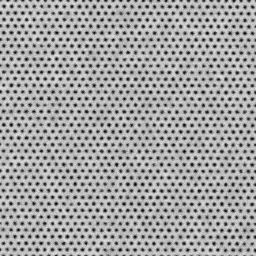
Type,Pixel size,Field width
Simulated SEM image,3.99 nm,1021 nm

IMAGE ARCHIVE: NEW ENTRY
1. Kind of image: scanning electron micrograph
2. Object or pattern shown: a regular array of holes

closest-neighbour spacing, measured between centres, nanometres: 28.9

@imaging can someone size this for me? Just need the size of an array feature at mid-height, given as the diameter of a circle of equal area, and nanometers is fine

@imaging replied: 12.7